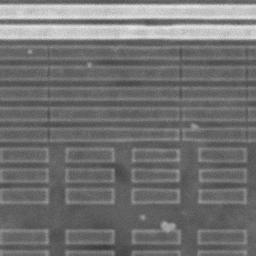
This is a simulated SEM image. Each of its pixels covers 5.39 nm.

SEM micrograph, wiring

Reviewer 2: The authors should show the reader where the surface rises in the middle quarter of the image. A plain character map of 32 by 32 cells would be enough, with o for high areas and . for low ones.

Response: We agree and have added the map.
......o.........................
ooooooooooooooooooooooooooooo.oo
ooooooooooooooooooooooooooooo.oo
oooooooooooooooooooooooooooooooo
................................
................................
ooooooooooooooooooooooooooooo.oo
ooooooooooooooooooooooooooooo.oo
ooooooooooooooooooooooooooooo.oo
................................
................................
ooooooooooooooooooooooooooooo.oo
ooooooooooooooooooooooooooooo.oo
ooooooooooooooooooooooooooooo.oo
................................
................................
ooooooooooooooooooooooooooooo.oo
ooooooooooooooooooooooooooooo.oo
ooooooooooooooooooooooooooooo.oo
................................
................................
.ooooooooooo.....oooooooooooo...
.ooooooooooo.....oooooooooooo...
.ooooooooooo.....oooooooooooo...
................................
................................
.ooooooooooo.....ooo............
.ooooooooooo.....oooooooooooo...
.ooooooooooo.....oooooooooooo...
................................
................................
.ooooooooooo.....oooooooo.......